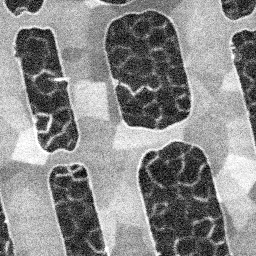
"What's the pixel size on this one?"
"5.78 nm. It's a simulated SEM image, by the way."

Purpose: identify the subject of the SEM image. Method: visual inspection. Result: one or a few lines or trenches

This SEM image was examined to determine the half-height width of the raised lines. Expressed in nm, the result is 286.